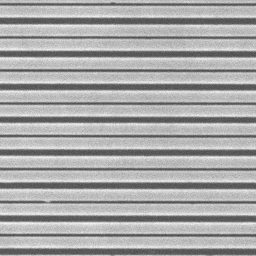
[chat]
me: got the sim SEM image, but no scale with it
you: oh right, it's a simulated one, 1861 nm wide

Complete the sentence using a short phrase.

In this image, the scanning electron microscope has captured parallel lines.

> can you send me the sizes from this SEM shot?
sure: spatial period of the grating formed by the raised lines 120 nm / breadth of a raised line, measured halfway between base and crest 83.6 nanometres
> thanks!